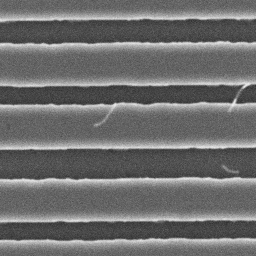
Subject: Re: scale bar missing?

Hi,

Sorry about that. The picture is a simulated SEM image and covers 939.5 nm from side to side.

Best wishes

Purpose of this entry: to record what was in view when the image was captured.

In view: lines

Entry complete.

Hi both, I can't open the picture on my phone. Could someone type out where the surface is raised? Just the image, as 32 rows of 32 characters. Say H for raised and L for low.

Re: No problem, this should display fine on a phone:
HHHHHHHHHHHHHHHHHHHHHHHHHHHHHHHH
HHHHHHHHHHHHHHHHHHHHHHHHHHHHHHHH
HLLLLLLLLLLLLLLLLLLLLLLLLLLLLLLL
LLLLLLLLLLLLLLLLLLLLLLLLLLLLLLLL
LLLLLLLLLLLLLLLLLLLLLLLLLLLLLLLL
HHLHHHLLHHHLHHHHHHHHHHHHHHHHHHHH
HHHHHHHHHHHHHHHHHHHHHHHHHHHHHHHH
HHHHHHHHHHHHHHHHHHHHHHHHHHHHHHHH
HHHHHHHHHHHHHHHHHHHHHHHHHHHHHHHH
HHHHHHHHHHHHHHHHHHHHHHHHHHHHHHHH
HHHHHHHHHHHHHHHHHHHHHHHHHHHHHHHH
LLLLLLLLLLLLLLLLLLLLLLLLLLLLLLLL
LLLLLLLLLLLLLLLLLLLLLLLLLLLLLLLL
HHHHHHHHHHHHHHHHHHHHHHHHHHHHHHHH
HHHHHHHHHHHHHHHHHHHHHHHHHHHHHHHH
HHHHHHHHHHHHHHHHHHHHHHHHHHHHHHHH
HHHHHHHHHHHHHHHHHHHHHHHHHHHHHHHH
HHHHHHHHHHHHHHHHHHHHHHHHHHHHHHHH
HHHHHHHHHLLLHHLLLLLLLLLLLLLLLLLL
LLLLLLLLLLLLLLLLLLLLLLLLLLLLLLLL
LLLLLLLLLLLLLLLLLLLLLLLLLLLLLLLL
LLLLLLLLLLLLLLLLLLLLLLLLLLLLLLLL
HHHHHHHHHHHHHHHHHHHHHHHHHHHHHHHH
HHHHHHHHHHHHHHHHHHHHHHHHHHHHHHHH
HHHHHHHHHHHHHHHHHHHHHHHHHHHHHHHH
HHHHHHHHHHHHHHHHHHHHHHHHHHHHHHHH
HHHHHHHHHHHHHHHHHHHHHHHHHHHHHHHH
HHHHHHHHHHHHHHHHHHHHLHHHHHLLLLLL
LLLLLLLLLLLLLLLLLLLLLLLLLLLLLLLL
LLLLLLLLLLLLLLLLLLLLLLLLLLLLLLLL
HHHHHHHHHHHHHHHHHHHHHHHHHHHHHHHH
HHHHHHHHHHHHHHHHHHHHHHHHHHHHHHHH